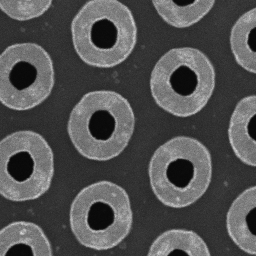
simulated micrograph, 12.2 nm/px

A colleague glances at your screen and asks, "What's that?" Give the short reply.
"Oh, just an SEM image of ring-shaped raised bodies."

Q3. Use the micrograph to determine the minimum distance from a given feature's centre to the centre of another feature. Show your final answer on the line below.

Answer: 1100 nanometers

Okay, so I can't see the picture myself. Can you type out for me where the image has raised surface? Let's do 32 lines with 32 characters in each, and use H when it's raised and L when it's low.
HHHHHHLLLLLHHHHLLLLHHHLLHHHLLLLL
HHHHHHLLLLHHHHHHLLLLHHHHHHLLLLLH
LLHLLLLLLHHHHLHHHLLLLHHHHLLLLLHH
LLLLLLLLLHHLLLHHHLLLLLLLLLLLLHHH
LLLLLLLLLHHLLLLHHLLLLLLLLLLLLHHL
LLHHLLLLLHHHLLHHHLLLLLLLLLLLLHHL
HHHHHHLLLLHHHHHHLLLLLHHHHLLLLHHH
HHHHHHLLLLHHHHHHLLLLHHHHHHLLLLHH
HHLLHHHLLLLLLLLLLLLHHHLLHHHLLLHH
HLLLLHHLLLLLLLLLLLLHHLLLLHHLLLLL
HHLLHHHLLLLLLLLLLLLHHLLLLHHLLLLL
HHHHHHLLLLLLHHLLLLLHHHLLHHHLLLLL
HHHHHLLLLLHHHHHHLLLHHHHHHHLLLLHH
LHHHLLLLLHHHHHHHLLLLHHHHHLLLLHHH
LLLLLLLLLHHLLLHHHLLLLLHLLLLLLHHH
LLLLLLLLLHHLLLHHHLLLLLLLLLLLLHHL
LLHHLLLLLHHLLLHHHLLLLLLLLLLLLHHL
HHHHHHLLLHHHHHHHLLLLLHHHLLLLLHHH
HHHHHHLLLLHHHHHHLLLLHHHHHHLLLHHH
HHLLHHHLLLLHHHLLLLLHHHHHHHLLLLHH
HLLLHHHLLLLLLLLLLLLHHLLLHHLLLLLH
HLLLHHHLLLLLLLLLLLLHHLLLHHLLLLLL
HHLHHHLLLLLLLLLLLLLHHLLLHHLLLLLL
HHHHHHLLLLLHHHHLLLLHHHHHHHLLLLLH
HHHHHLLLLLHHHHHHLLLLHHHHHLLLLLHH
LLLLLLLLLHHHLHHHLLLLLHHHLLLLLHHH
LLLLLLLLLHHLLLHHLLLLLLLLLLLLLHHL
LLLLLLLLLHHLLLHHLLLLLLLLLLLLHHHL
LHHHHLLLLHHLLHHHLLLLLLLLLLLLHHHL
HHHHHHLLLHHHHHHHLLLLHHHHHLLLLHHH
HHLHHHLLLLHHHHHLLLLHHHHHHHLLLLHH
HLLLHHLLLLLLLLLLLLLHHLLHHHLLLLLH